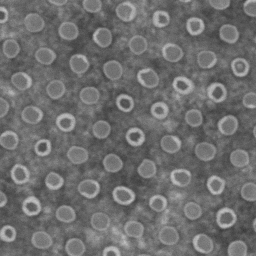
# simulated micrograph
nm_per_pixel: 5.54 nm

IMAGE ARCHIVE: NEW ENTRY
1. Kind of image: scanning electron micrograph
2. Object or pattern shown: a regular array of raised bodies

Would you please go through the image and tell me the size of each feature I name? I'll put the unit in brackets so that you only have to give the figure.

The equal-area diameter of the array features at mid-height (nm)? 104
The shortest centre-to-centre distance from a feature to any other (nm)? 190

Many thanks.